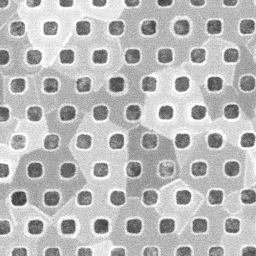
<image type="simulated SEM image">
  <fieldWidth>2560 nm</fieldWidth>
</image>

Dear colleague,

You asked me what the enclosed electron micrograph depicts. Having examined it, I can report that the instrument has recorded a regular array of holes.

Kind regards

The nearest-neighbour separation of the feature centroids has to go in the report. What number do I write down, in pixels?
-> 32.5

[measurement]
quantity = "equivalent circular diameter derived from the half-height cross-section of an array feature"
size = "0.174 micrometres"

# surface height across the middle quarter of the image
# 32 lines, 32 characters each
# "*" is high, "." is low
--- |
********************************
********************************
********************************
***....*****...*****...*****...*
***....****....****.....***.....
***....****....****....****.....
***....****....****....*****...*
********************************
********************************
********************************
...*****...*****...*****...*****
...****....*****....***.....***.
...****....****.....***.....***.
...****....****....*****...*****
********.***********************
********************************
********************************
****..******...*****...*****...*
***....****....****....****.....
***....****....****.....***.....
***....****....*****...*****....
********************************
********************************
********************************
..******..******...******..*****
...****....****....*****....****
...****....****.....****....****
...****....****....*****...*****
..******..**********************
********************************
********************************
*****.******...******..******..*